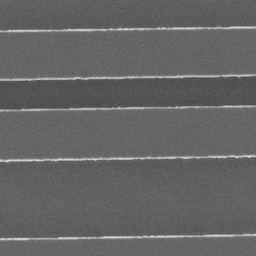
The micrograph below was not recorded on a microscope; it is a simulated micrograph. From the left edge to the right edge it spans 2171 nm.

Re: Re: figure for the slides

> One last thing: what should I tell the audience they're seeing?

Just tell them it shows lines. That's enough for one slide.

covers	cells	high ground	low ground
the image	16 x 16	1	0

0000000000000000
0000000000000000
1111111111111111
1111111111111111
1111111111111111
0000000000000000
0000000000000000
1111111111111111
1111111111111111
1111111111111111
0000000000000000
0000000000000000
0000000000000000
0000000000000000
0000000000000000
1111111111111111